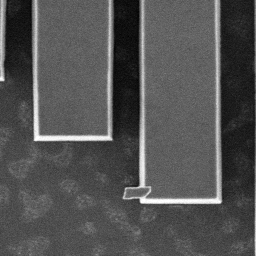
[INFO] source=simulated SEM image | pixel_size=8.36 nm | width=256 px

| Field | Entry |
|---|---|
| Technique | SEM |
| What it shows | one or a few lines or trenches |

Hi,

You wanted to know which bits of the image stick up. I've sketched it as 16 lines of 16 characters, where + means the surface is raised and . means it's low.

..+++++..+++++..
..+++++..+++++..
..+++++..+++++..
..+++++..+++++..
..+++++..+++++..
..+++++..+++++..
..+++++..+++++..
..+++++..+++++..
...++++..+++++..
.........+++++..
.........+++++..
.........+++++..
.........++++...
................
................
................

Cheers